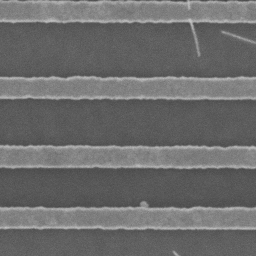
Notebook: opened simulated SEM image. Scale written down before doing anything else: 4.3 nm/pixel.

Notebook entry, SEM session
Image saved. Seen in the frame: lines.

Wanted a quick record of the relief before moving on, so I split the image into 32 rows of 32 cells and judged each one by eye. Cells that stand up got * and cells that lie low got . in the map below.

********************************
********************************
********************************
................................
................................
................................
................................
................................
................................
................................
********************************
********************************
................................
................................
................................
................................
................................
................................
********************************
********************************
********************************
................................
................................
................................
................................
................................
********************************
********************************
********************************
................................
................................
................................